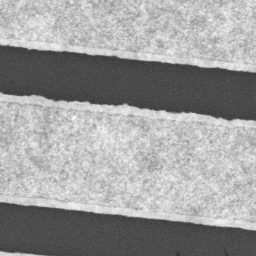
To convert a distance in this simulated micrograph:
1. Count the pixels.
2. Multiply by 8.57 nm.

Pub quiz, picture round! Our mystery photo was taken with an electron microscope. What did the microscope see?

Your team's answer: one or a few lines or trenches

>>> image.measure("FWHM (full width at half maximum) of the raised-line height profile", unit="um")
0.857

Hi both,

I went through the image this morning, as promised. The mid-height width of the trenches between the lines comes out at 486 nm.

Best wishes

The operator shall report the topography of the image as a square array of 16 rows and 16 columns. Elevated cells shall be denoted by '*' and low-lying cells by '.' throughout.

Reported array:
****************
****************
****************
.........*******
................
................
***.............
*************...
****************
****************
****************
****************
.***************
...........*****
................
................